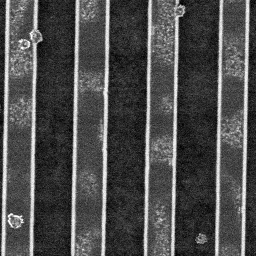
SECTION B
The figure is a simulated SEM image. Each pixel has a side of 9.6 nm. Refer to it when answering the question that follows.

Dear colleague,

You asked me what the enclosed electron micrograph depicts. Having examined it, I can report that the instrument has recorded one or a few lines or trenches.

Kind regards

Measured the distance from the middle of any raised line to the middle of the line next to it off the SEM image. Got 680 nm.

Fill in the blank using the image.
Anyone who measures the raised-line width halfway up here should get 28.3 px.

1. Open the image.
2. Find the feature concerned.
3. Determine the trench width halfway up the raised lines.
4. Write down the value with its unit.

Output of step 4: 403 nm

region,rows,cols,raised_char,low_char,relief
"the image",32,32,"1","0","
01110000001110000001110000001110
01110000001110000001111000001110
01110000001110000001110000001110
01111000001110000001110000001110
01111000001110000001110000001110
01111000001110000001110000001110
01110000001110000001110000001110
01110000001110000001110000001110
01110000001110000001110000001110
01110000001110000001110000001110
01110000001110000001110000001110
01110000011110000001110000001110
01110000011110000001110000001110
01110000011110000001110000011110
01110000011110000001110000011110
01110000011110000001110000011110
01110000011110000011110000011110
01110000011110000011110000011110
01110000011110000011110000011110
01110000011110000011110000011110
01110000011110000011110000011110
01110000011110000011110000011110
01110000011110000011110000011110
01110000011110000011110000011110
01110000011110000011110000011110
01110000011110000011110000011100
01110000011110000011110000011100
01110000011110000011110000011100
11110000011110000011110000011100
11110000011110000011110000011100
11110000011110000011110000011100
11110000011110000011110000011100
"